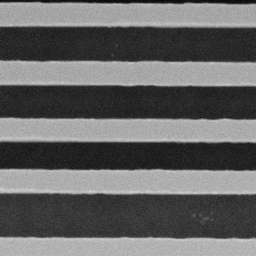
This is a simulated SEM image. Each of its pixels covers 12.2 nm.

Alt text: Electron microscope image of lines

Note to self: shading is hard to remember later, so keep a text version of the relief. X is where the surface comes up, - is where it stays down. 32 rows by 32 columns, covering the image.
XXXXXXXXXXXXXXXXXXXXXXXXXXXXX--X
XXXXXXXXXXXXXXXXXXXXXXXXXXXXXXXX
XXXXXXXXXXXXXXXXXXXXXXXXXXXXXXXX
--------------------------------
--------------------------------
--------------------------------
--------------------------------
--------------------------------
XXXXXXXXXXXXXXXXXXXXXXXXXXXXXXXX
XXXXXXXXXXXXXXXXXXXXXXXXXXXXXXXX
XXXXXXXXXXXXXXXXXXXXXXXXXXXXXXXX
--------------------------------
--------------------------------
--------------------------------
--------------------------------
XXXXXXXXXXXXXXXXXXXXXXXXXXXXXXXX
XXXXXXXXXXXXXXXXXXXXXXXXXXXXXXXX
XXXXXXXXXXXXXXXXXXXXXXXXXXXXXXXX
--------------------------------
--------------------------------
--------------------------------
XXXXXXXXXXXXXXXXXXXXXXXXXXXXXXXX
XXXXXXXXXXXXXXXXXXXXXXXXXXXXXXXX
XXXXXXXXXXXXXXXXXXXXXXXXXXXXXXXX
--------------------------------
--------------------------------
--------------------------------
--------------------------------
--------------------------------
--------------------------------
XXXXXXXXXXXXXXXXXXXXXXXXXXXXXXXX
XXXXXXXXXXXXXXXXXXXXXXXXXXXXXXXX